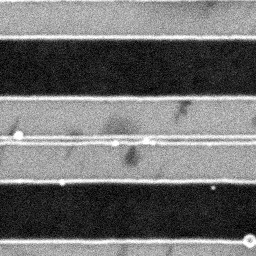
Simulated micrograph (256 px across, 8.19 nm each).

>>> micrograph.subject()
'lines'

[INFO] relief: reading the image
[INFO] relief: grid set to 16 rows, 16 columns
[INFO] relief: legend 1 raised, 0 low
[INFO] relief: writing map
0000000000000000
0000000000000000
1111111111111111
1111111111111111
1111111111111111
1111111111111111
0000000000000000
0000000000000000
0000000000000000
0000000000000000
0000000000000000
1111111111111111
1111111111111111
1111111111111111
1111111111111111
0000000000000000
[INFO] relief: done